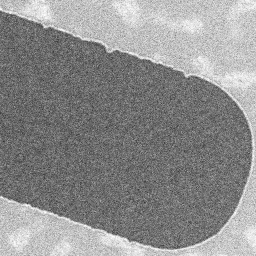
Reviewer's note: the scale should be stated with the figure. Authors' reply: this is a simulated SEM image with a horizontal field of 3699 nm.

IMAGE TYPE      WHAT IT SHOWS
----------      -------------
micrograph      one or a few lines or trenches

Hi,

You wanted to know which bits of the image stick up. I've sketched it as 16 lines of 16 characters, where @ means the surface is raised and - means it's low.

----------------
@@@-------------
@@@@@@----------
@@@@@@@@@-------
@@@@@@@@@@@-----
@@@@@@@@@@@@@@--
@@@@@@@@@@@@@@@-
@@@@@@@@@@@@@@@-
@@@@@@@@@@@@@@@@
@@@@@@@@@@@@@@@@
@@@@@@@@@@@@@@@@
@@@@@@@@@@@@@@@-
-@@@@@@@@@@@@@@-
----@@@@@@@@@@@-
------@@@@@@@@--
----------@@----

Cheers